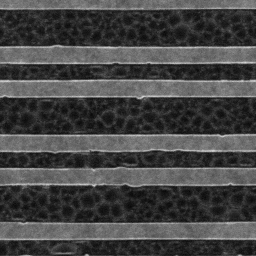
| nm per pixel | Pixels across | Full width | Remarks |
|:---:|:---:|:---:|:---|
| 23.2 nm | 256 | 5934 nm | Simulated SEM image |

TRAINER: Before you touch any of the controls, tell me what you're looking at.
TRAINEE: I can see parallel lines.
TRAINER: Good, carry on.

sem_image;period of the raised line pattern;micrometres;1.02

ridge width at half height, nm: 385